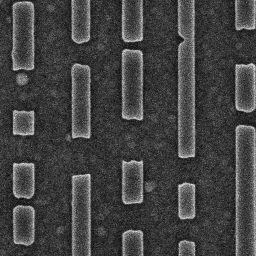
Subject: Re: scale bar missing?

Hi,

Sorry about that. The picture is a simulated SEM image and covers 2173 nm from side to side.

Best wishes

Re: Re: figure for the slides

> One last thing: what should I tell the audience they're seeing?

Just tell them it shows parallel lines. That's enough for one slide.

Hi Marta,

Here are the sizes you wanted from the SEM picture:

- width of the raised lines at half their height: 167 nanometers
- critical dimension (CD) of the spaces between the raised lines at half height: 327 nm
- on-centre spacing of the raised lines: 465 nanometers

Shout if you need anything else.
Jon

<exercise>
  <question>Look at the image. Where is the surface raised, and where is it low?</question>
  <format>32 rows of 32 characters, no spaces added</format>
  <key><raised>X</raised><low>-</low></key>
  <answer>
--XX-----XX----XXX----XX------XX
--XX-----XX----XXX----XX------XX
--XX-----XX----XXX----XX------XX
--XX-----XX----XXX----XX------XX
--XX-----XX----XXX-----X--------
--XX-------------------X--------
--XX-----------XX-----XX--------
--XX-----------XXX----XX--------
--XX-----XX----XXX----XX------XX
--X------XX----XXX----XX------XX
---------XX----XXX----XX------XX
---------XX----XXX----XX------XX
---------XX----XXX----XX------XX
---------XX----XXX----XX------XX
--XX-----XX----XXX----XX--------
--XX-----XX-----------XX--------
--XX-----XX-----------XX------XX
----------------------XX------XX
----------------------XX------XX
-----------------------X------XX
--XX------------XX------------XX
--XX-----------XXX------------XX
--XX-----XX----XXX------------XX
--XX-----XX----XXX----XX------XX
--XX-----XX----XXX----XX------XX
---------XX-----------XX------XX
--XX-----XX-----------XX------XX
--XX-----XX-------------------XX
--XX-----XX-------------------XX
--XX-----XX----XXX------------XX
--XX-----XX----XXX----XX------XX
---------XX----XXX----XX------XX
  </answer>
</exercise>